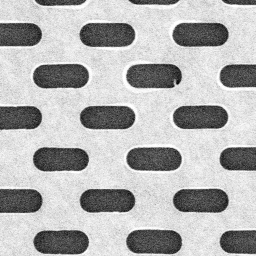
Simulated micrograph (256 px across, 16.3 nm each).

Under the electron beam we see groups of lines, slits or small figures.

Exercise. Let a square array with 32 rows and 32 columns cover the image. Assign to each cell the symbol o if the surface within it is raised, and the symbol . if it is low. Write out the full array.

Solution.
ooooo......oooooo.....oooooo....
oooooooooooooooooooooooooooooooo
oooooooooooooooooooooooooooooooo
.....ooooo.......ooooo......oooo
.....ooooo.......oooo........ooo
.....ooooo.......ooooo......oooo
oooooooooooooooooooooooooooooooo
oooooooooooooooooooooooooooooooo
oooo.......ooooo......oooooo....
oooo.......ooooo.......oooo.....
oooo.......ooooo......oooooo....
oooooooooooooooooooooooooooooooo
oooooooooooooooooooooooooooooooo
.....oooooo......ooooo......oooo
.....ooooo.......ooooo.......ooo
.....ooooo.......ooooo......oooo
oooooooooooooooooooooooooooooooo
oooooooooooooooooooooooooooooooo
ooooo.....ooooooo.....oooooo....
oooo.......ooooo.......oooo.....
oooo.......ooooo.......ooooo....
oooooo....ooooooo....ooooooooooo
oooooooooooooooooooooooooooooooo
....ooooooooooooooooooo....ooooo
.....ooooo.......ooooo......oooo
.....ooooo.......ooooo.......ooo
.....oooooo.....ooooooo.....oooo
oooooooooooooooooooooooooooooooo
oooooooooooooooooo.ooooooooooooo
oooo.......ooooo.......ooooo....
oooo.......ooooo.......oooo.....
ooooo......ooooo......oooooo....